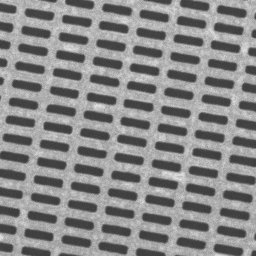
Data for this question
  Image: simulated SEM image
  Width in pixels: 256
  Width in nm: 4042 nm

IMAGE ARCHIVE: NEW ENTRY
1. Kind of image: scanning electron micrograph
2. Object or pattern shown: a regular array of holes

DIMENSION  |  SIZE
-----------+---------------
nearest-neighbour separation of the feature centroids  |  283 nm